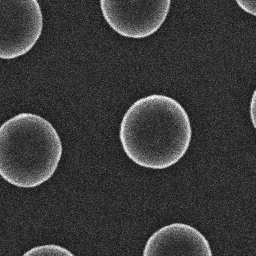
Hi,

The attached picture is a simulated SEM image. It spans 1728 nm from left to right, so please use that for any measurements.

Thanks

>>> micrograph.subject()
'raised bodies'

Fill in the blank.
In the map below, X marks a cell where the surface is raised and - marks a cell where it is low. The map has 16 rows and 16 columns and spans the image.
XX----XXXX-----X
XXX----XXX------
XX--------------
X---------------
----------------
----------------
---------XX-----
-XX-----XXXX----
XXXX----XXXX----
XXXX----XXX-----
XXX-------------
-X--------------
----------------
----------------
----------XX----
--XX-----XXXX---